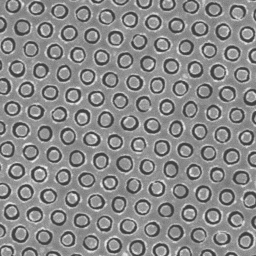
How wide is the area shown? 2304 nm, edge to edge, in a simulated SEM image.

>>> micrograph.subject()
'a regular array of ring-shaped grooves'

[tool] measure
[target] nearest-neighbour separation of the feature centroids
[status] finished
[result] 204 nm